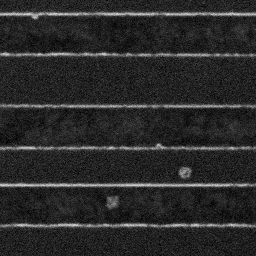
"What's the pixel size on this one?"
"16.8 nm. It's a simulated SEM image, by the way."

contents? lines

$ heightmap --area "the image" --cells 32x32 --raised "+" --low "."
++++++++++++++++++++++++++++++++
++++++++++++++++++++++++++++++++
................................
................................
................................
................................
................................
++++++++++++++++++++++++++++++++
++++++++++++++++++++++++++++++++
++++++++++++++++++++++++++++++++
++++++++++++++++++++++++++++++++
++++++++++++++++++++++++++++++++
++++++++++++++++++++++++++++++++
................................
................................
................................
................................
................................
...............+....+...........
++++++++++++++++++++++++++++++++
++++++++++++++++++++++++++++++++
++++++++++++++++++++++++++++++++
++++++++++++++++++++++++++++++++
................................
................................
................................
................................
................................
++++++++++++++++++++++++++++++++
++++++++++++++++++++++++++++++++
++++++++++++++++++++++++++++++++
++++++++++++++++++++++++++++++++